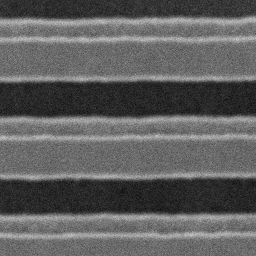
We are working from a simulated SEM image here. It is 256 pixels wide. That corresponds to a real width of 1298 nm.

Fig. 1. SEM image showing lines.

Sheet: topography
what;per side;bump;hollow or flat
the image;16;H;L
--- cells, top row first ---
LLLLLLLLLLLLLLLL
HHHHHHHHHHHHHHHH
HHHHHHHHHHHHHHHH
HHHHHHHHHHHHHHHH
HHHHHHHHHHHHHHHH
LLLLLLLLLLLLLLLL
LLLLLLLLLLLLLLLL
HHLLHHHLLHHHHHHH
HHHHHHHHHHHHHHHH
HHHHHHHHHHHHHHHH
HHHHHHHHHHHHHHHH
LLLLLLLLLLLLLLLL
LLLLLLLLLLLLLLLL
LLLLLLHLLLLLLLLL
HHHHHHHHHHHHHHHH
HHHHHHHHHHHHHHHH